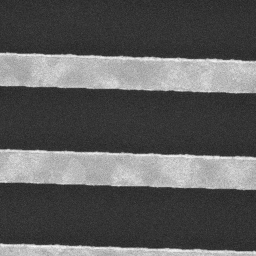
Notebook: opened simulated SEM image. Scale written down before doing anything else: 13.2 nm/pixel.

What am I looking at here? lines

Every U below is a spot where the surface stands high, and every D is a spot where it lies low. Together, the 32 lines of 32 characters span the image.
DDDDDDDDDDDDDDDDDDDDDDDDDDDDDDDD
DDDDDDDDDDDDDDDDDDDDDDDDDDDDDDDD
DDDDDDDDDDDDDDDDDDDDDDDDDDDDDDDD
DDDDDDDDDDDDDDDDDDDDDDDDDDDDDDDD
DDDDDDDDDDDDDDDDDDDDDDDDDDDDDDDD
DDDDDDDDDDDDDDDDDDDDDDDDDDDDDDDD
DDDDDDDDDDDDDDDDDDDDDDDDDDDDDDDD
UUUUUUUUUUUUUUUUUUUUUUUUDDDDDDDD
UUUUUUUUUUUUUUUUUUUUUUUUUUUUUUUU
UUUUUUUUUUUUUUUUUUUUUUUUUUUUUUUU
UUUUUUUUUUUUUUUUUUUUUUUUUUUUUUUU
DDDDDDDDDDDDDDDDDDDDDDDDDDDDUUUU
DDDDDDDDDDDDDDDDDDDDDDDDDDDDDDDD
DDDDDDDDDDDDDDDDDDDDDDDDDDDDDDDD
DDDDDDDDDDDDDDDDDDDDDDDDDDDDDDDD
DDDDDDDDDDDDDDDDDDDDDDDDDDDDDDDD
DDDDDDDDDDDDDDDDDDDDDDDDDDDDDDDD
DDDDDDDDDDDDDDDDDDDDDDDDDDDDDDDD
DDDDDDDDDDDDDDDDDDDDDDDDDDDDDDDD
UUUUUUUUUUUUUUUUUUUUUUDDDDDDDDDD
UUUUUUUUUUUUUUUUUUUUUUUUUUUUUUUU
UUUUUUUUUUUUUUUUUUUUUUUUUUUUUUUU
UUUUUUUUUUUUUUUUUUUUUUUUUUUUUUUU
DDDDDDDDDDDDDDDDDDDDDDDDDUUUUUUU
DDDDDDDDDDDDDDDDDDDDDDDDDDDDDDDD
DDDDDDDDDDDDDDDDDDDDDDDDDDDDDDDD
DDDDDDDDDDDDDDDDDDDDDDDDDDDDDDDD
DDDDDDDDDDDDDDDDDDDDDDDDDDDDDDDD
DDDDDDDDDDDDDDDDDDDDDDDDDDDDDDDD
DDDDDDDDDDDDDDDDDDDDDDDDDDDDDDDD
DDDDDDDDDDDDDDDDDDDDDDDDDDDDDDDD
UUUUUUUUUUUUUUUUUUUUUUUUUUUUUUUD